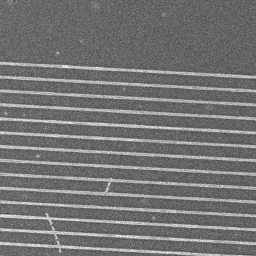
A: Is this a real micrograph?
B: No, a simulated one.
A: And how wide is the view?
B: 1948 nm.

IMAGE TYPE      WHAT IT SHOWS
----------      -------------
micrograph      parallel lines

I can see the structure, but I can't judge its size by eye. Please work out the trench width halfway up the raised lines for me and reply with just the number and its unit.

0.0921 um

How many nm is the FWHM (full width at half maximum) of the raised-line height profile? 12.3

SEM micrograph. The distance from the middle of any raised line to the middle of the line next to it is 105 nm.